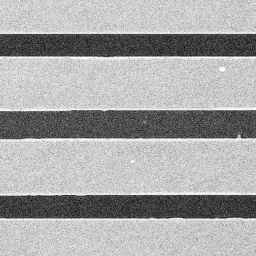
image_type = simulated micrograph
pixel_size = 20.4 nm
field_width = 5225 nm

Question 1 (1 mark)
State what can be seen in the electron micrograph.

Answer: lines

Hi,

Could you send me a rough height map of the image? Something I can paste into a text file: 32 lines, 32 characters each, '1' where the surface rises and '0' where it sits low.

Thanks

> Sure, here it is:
11111111111111111111111111111111
11111111111111111111111111111111
11111111111111111111111111111111
11111111111111111111111111111111
00000000000000000000000000000000
00000000000000000000000000000000
00000000000000000000000000000000
11111111111111111111111111111111
11111111111111111111111111111111
11111111111111111111111111111111
11111111111111111111111111111111
11111111111111111111111111111111
11111111111111111111111111111111
11111111111111111111111111111111
00000000000000000000000000000000
00000000000000000000000000000000
00000000000000000000000000000000
00011111111111111111111111111111
11111111111111111111111111111111
11111111111111111111111111111111
11111111111111111111111111111111
11111111111111111111111111111111
11111111111111111111111111111111
11111111111111111111111111111111
00000000000000000000000000000000
00000000000000000000000000000000
00000000000000000000000000000000
11111111111111111111111111111111
11111111111111111111111111111111
11111111111111111111111111111111
11111111111111111111111111111111
11111111111111111111111111111111